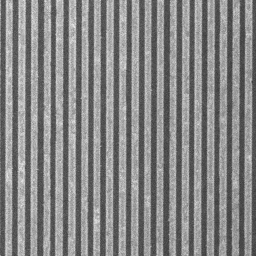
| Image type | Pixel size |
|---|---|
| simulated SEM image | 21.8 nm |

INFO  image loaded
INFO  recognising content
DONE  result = parallel lines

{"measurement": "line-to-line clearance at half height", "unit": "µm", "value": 0.141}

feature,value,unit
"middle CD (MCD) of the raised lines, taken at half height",122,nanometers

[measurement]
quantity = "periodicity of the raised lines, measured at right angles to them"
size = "274 nanometers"